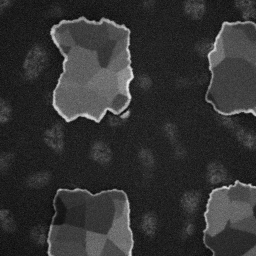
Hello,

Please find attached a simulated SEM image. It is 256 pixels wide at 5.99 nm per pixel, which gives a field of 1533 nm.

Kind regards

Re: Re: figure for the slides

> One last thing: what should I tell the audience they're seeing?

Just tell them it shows raised bodies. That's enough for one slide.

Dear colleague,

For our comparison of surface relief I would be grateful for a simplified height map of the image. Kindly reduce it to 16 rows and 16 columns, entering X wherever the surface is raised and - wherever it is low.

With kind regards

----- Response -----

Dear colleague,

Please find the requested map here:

----------------
----XXX-------XX
---XXXXX------XX
----XXXX-----XXX
----XXXX-----XXX
----XXXX-----XXX
---XXXXX-----XXX
----------------
----------------
----------------
----------------
----------------
---XXXXX-----XXX
---XXXXX-----XXX
---XXXXX-----XXX
---XXXXX-----XXX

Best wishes